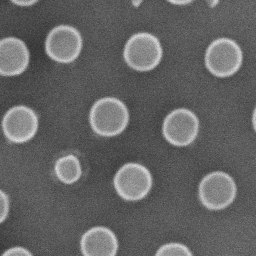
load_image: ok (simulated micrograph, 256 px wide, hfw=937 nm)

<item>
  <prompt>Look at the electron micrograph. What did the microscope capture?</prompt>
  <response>a regular array of raised bodies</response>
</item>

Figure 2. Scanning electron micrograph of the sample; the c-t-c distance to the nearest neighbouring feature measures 265 nm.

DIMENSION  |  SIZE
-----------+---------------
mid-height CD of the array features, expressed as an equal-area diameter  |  132 nm